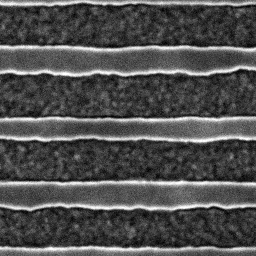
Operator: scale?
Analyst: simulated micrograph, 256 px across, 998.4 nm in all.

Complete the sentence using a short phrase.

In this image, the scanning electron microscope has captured lines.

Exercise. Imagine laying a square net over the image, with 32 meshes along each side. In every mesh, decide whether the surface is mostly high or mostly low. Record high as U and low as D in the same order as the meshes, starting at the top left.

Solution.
UUUUUUUUUDDDUUUUDDDDDDDDDDUUUUUD
DDDDDDDDDDDDDDDDDDDDDDDDDDDDDDDD
DDDDDDDDDDDDDDDDDDDDDDDDDDDDDDDD
DDDDDDDDDDDDDDDDDDDDDDDDDDDDDDDD
DDDDDDDDDDDDDDDDDDDDDDDDDDDDDDDD
DDDDDDDDDDDDDDDDDDDDDDDDDDDDDDDD
UUUUUUUUUUUUUUUUUUUUUUUUUUUUUUUU
UUUUUUUUUUUUUUUUUUUUUUUUUUUUUUUU
UUUUUUUUUUUUUUUUUUUUUUUUUUUUUUUU
DDDDDDDDDDDDDDDDDDDDDDDDDDDDDDDD
DDDDDDDDDDDDDDDDDDDDDDDDDDDDDDDD
DDDDDDDDDDDDDDDDDDDDDDDDDDDDDDDD
DDDDDDDDDDDDDDDDDDDDDDDDDDDDDDDD
DDDDDDDDDDDDDDDDDDDDDDDDDDDDDDDD
DDDDDDDDDDDDDDDDDDDDDDDDDDDDDDDD
UUUUUUUUUUUUUUUUUUUUUUUUUUUUUUUU
UUUUUUUUUUUUUUUUUUUUUUUUUUUUUUUU
DDDDDUUDDDDDDDDDDDDDDUUUUUUDDDDD
DDDDDDDDDDDDDDDDDDDDDDDDDDDDDDDD
DDDDDDDDDDDDDDDDDDDDDDDDDDDDDDDD
DDDDDDDDDDDDDDDDDDDDDDDDDDDDDDDD
DDDDDDDDDDDDDDDDDDDDDDDDDDDDDDDD
DDDDDDDDDDDDDDDDDDDDDDDDDDDDDDDD
UUUUUUUUUUUUUUUUUUUUUUUUUUUUUUUU
UUUUUUUUUUUUUUUUUUUUUUUUUUUUUUUU
UUUUUUUUUUUUUUUUUUUUUUUUUUUUUUUU
DDDDDDDDDDDDDDDDDDDDDDDDDDDDDDDD
DDDDDDDDDDDDDDDDDDDDDDDDDDDDDDDD
DDDDDDDDDDDDDDDDDDDDDDDDDDDDDDDD
DDDDDDDDDDDDDDDDDDDDDDDDDDDDDDDD
DDDDDDDDDDDDDDDDDDDDDDDDDDDDDDDD
UUUUUUUUUUUUUUUUUUUUUUUUUUUUUUUU